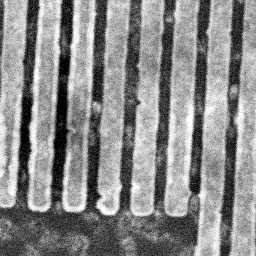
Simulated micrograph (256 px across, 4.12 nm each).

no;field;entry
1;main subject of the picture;parallel lines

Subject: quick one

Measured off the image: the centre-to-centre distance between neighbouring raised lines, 142 nm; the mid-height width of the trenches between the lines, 56.6 nanometres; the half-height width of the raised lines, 21.1 px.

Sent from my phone